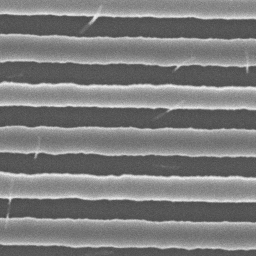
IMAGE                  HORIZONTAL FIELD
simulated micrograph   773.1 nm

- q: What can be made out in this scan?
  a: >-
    lines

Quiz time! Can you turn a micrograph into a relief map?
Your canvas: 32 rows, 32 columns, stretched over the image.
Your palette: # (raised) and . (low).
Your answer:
################################
################################
................................
................................
#####.##........................
################################
################################
################################
................................
................................
###....##.......................
################################
################################
..................##############
................................
................................
################################
################################
################################
.......................#########
................................
................................
################################
################################
################################
................................
................................
##################..............
################################
################################
################################
................................